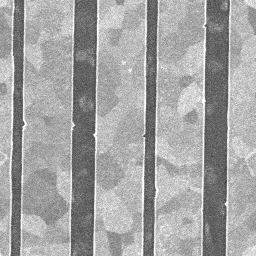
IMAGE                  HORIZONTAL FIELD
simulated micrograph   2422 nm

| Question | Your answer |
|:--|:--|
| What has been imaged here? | one or a few lines or trenches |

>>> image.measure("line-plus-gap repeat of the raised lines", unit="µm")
0.627